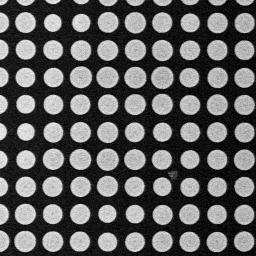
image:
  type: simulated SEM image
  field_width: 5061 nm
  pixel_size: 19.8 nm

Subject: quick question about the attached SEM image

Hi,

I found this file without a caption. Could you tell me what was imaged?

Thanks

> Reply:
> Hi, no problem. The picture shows an array of small figures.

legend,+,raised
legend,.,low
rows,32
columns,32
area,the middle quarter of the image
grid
................................
..++++...++++...++++...++++...++
..+++++.+++++..+++++..+++++..+++
..+++++.+++++..+++++..+++++..+++
..+++++..++++..+++++..+++++..+++
...+++...+++....+++....+++....++
................................
................................
..++++...++++...++++..+++++...++
..++++...++++..+++++..+++++..+++
..++++...++++..+++++..+++++..+++
..++++...++++...++++..+++++..+++
....+.....++.....++.....++.....+
................................
................................
..++++...++++...++++...+++....++
..+++++.+++++..+++++..+++++..+++
..+++++.+++++..+++++..+++++..+++
..++++...++++...++++...+++....++
...++.....++....................
................................
...++.....++.....+..............
..++++...++++...++++..++++....++
.++++++.++++++.+++++..+++++..+++
..+++++.+++++..+++++..+++++..+++
..++++...++++...++++...+++....++
..........++....................
................................
...++....+++.....++.....+.......
..++++...++++...++++...+++...+++
..+++++.+++++..+++++..+++++..+++
..+++++.+++++..+++++..+++++..+++